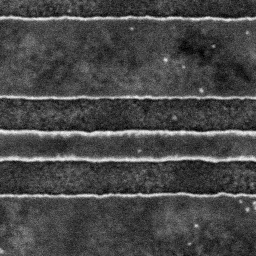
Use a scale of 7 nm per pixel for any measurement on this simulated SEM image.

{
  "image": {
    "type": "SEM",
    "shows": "lines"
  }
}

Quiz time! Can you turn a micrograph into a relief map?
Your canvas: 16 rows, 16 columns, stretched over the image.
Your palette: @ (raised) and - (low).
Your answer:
----------------
@@@@@@@@@@@@@@@@
@@@@@@@@@@@@@@@@
@@@@@@@@@@@@@@@@
@@@@@@@@@@@@@@@@
@@@@@@@@@@@@@@@@
----------------
----------------
@@@@@@@@@@@@@@@@
@@@@@@@@@@@@@@@@
----------------
----------------
@@@@@@@@@@@@@@@@
@@@@@@@@@@@@@@@@
@@@@@@@@@@@@@@@@
@@@@@@@@@@@@@@@@